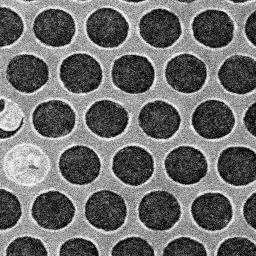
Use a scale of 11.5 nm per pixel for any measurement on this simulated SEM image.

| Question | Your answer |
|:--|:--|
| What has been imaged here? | a regular array of holes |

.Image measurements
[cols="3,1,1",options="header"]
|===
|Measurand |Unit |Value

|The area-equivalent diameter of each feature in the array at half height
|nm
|480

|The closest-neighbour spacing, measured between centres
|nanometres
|601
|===